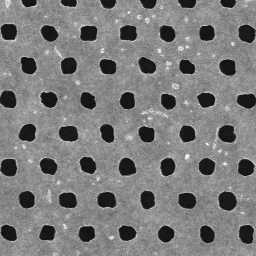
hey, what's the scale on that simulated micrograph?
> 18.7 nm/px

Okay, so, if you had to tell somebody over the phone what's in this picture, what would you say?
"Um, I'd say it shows a regular array of holes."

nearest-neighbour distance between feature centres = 714 nanometers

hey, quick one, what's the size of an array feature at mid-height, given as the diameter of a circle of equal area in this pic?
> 310 nanometres